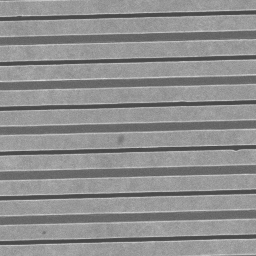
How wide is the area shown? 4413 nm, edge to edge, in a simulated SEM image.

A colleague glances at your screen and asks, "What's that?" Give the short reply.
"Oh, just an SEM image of parallel lines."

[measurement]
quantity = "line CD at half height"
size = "274 nanometres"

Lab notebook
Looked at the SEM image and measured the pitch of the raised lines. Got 390 nm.